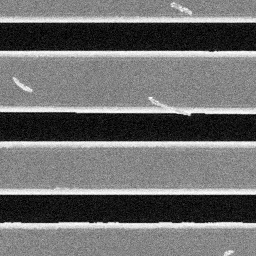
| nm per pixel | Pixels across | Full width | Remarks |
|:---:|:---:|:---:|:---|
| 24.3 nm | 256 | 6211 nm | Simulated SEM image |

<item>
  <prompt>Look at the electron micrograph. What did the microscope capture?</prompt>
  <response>lines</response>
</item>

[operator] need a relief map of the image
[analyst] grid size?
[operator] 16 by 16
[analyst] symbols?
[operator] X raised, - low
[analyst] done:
XXXXXXXXXXXXXXXX
----------------
----------------
XXXXXXXXXXXXXXXX
XXXXXXXXXXXXXXXX
XXXXXXXXXXXXXXXX
XXXXXXXXXXXXXXXX
----------------
----------------
XXXXXXXXXXXXXXXX
XXXXXXXXXXXXXXXX
XXXXXXXXXXXXXXXX
----------------
----------------
XXXXXXXXXXXXXXXX
XXXXXXXXXXXXXXXX